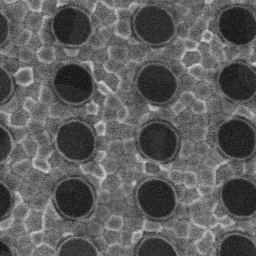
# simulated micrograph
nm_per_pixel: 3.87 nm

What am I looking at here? a regular array of raised bodies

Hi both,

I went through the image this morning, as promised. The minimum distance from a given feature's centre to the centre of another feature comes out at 221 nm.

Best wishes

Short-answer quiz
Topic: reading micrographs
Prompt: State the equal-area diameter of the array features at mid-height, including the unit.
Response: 159 nm